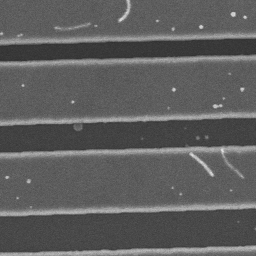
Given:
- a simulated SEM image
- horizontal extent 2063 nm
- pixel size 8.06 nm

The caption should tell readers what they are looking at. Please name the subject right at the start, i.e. lines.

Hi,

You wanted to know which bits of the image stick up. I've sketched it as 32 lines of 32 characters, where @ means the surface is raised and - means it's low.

@@@@@@@@@@@@@@@@@@@@@@@@@@@@@@@@
@@@@@@@@@@@@@@@@@@@@@@@@@@@@@@@@
@@@@@@@@@@@@@@@@@@@@@@@@@@@@@@@@
@@@@@@@@@@@@@@@@@@@@@@@@@@@@@@@@
@@@@@@@@@@@@@@@@@@@@@@@@@@@@@@@@
@@@@----------------------------
--------------------------------
--------@@@@@@@@@@@@@@@@@@@@@@@@
@@@@@@@@@@@@@@@@@@@@@@@@@@@@@@@@
@@@@@@@@@@@@@@@@@@@@@@@@@@@@@@@@
@@@@@@@@@@@@@@@@@@@@@@@@@@@@@@@@
@@@@@@@@@@@@@@@@@@@@@@@@@@@@@@@@
@@@@@@@@@@@@@@@@@@@@@@@@@@@@@@@@
@@@@@@@@@@@@@@@@@@@@@@@@@@@@@@@@
@@@@@@@@@@@@@@@@@@@@@@@@@@@@@@@@
@@@@----------------------------
--------------------------------
--------------------------------
------------------------@@-@@@@@
@@@@@@@@@@@@@@@@@@@@@@@@@@@@@@@@
@@@@@@@@@@@@@@@@@@@@@@@@@@@@@@@@
@@@@@@@@@@@@@@@@@@@@@@@@@@@@@@@@
@@@@@@@@@@@@@@@@@@@@@@@@@@@@@@@@
@@@@@@@@@@@@@@@@@@@@@@@@@@@@@@@@
@@@@@@@@@@@@@@@@@@@@@@@@@@@@@@@@
@@@@@@@@@@@@@@@@@@@@@@@@@@@@@@@@
@@@@@@@@@@@@@-------------------
--------------------------------
--------------------------------
--------------------------------
--------------------------------
-----------@@@@@@@@@@@@@@@@@@@@@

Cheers